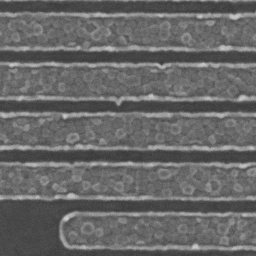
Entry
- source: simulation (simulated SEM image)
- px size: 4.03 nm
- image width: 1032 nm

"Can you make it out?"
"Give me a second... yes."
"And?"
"parallel lines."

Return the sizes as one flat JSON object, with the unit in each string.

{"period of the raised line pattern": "200 nm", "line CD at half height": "148 nanometres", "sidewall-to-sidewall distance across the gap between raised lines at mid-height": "13.5 px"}